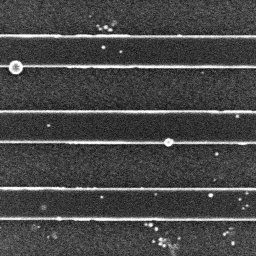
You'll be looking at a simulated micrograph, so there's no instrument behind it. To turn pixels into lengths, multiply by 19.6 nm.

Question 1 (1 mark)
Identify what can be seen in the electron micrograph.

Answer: lines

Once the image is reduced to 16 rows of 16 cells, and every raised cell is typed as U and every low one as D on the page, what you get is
DDDDDDDDDDDDDDDD
DDDDDDDDDDDDDDDD
UUUUUUUUUUUUUUUU
UUUUUUUUUUUUUUUU
DDDDDDDDDDDDDDDD
DDDDDDDDDDDDDDDD
DDDDDDDDDDDDDDDD
UUUUUUUUUUUUUUUU
UUUUUUUUUUUUUUUU
DDDDDDDDDDDDDDDD
DDDDDDDDDDDDDDDD
DDDDDDDDDDDDDDDD
UUUUUUUUUUUUUUUU
UUUUUUUUUUUUUUUU
DDDDDDDDDDDDDDDD
DDDDDDDDDDDDDDDD